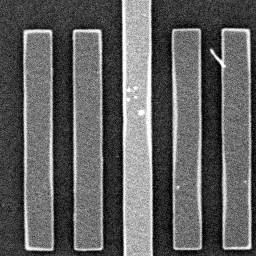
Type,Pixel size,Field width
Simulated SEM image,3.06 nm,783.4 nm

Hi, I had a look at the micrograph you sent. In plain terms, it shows groups of lines, slits or small figures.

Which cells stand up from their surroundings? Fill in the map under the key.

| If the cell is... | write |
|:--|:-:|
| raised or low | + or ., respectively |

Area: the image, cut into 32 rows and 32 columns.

...............++++.............
...............++++.............
...............++++.............
...............++++.............
...+++...++++...+++...+++...+++.
...+++...++++...+++...+++...+++.
...+++...++++...+++...+++...+++.
...+++...++++...+++...+++...+++.
...+++...++++...+++...+++...+++.
...+++...++++...+++...+++...+++.
...+++...++++...+++...+++...+++.
...+++...++++...+++...+++...+++.
...+++...++++...+++...+++...+++.
...+++...++++...+++...+++...+++.
...+++...++++...+++...+++...+++.
...+++...++++...+++...+++...+++.
...+++...++++...+++...+++...+++.
...+++...++++...+++...+++...+++.
...+++...++++..++++...+++...+++.
...+++...++++..++++...+++...+++.
...+++...++++..++++...+++...+++.
...+++...++++...+++...+++...+++.
...+++...++++...+++...+++...+++.
...+++...++++...+++...+++...+++.
...+++...++++..++++...+++...+++.
...++++..++++..++++...+++...+++.
...++++..++++..++++...+++...+++.
...++++..++++..++++...+++...+++.
...++++..++++...+++...+++...+++.
...++++..++++...+++...+++...+++.
...++++..++++...+++...+++...+++.
................+++.............